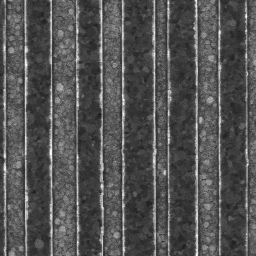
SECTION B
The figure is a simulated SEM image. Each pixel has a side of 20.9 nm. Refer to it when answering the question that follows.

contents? parallel lines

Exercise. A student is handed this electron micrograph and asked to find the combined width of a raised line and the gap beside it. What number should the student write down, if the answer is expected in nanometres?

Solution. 1020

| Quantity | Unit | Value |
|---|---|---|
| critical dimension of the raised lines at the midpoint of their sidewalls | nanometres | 591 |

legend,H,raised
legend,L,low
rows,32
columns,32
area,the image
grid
HLLHHHLLLLHHHLLHHHHLLHHHHLLHHHHL
HLLHHHLLLLHHHLLHHHHLLHHHHLLHHHHL
HLLHHHLLLLHHHLLHHHHLLHHHHLLHHHHL
HLLHHHLLLLHHHLLHHHHLLHHHHLLHHHHL
HLLHHHLLLLHHHLLHHHHLLHHHHLLHHHHL
HLLHHHLLLLHHHLLHHHHLLHHHHLLHHHHL
HLLHHHLLLLHHHLLHHHHLLHHHHLLHHHHL
HLLHHHLLLLHHHLLHHHHLLHHHHLLHHHHL
HLLHHHLLLLHHHLLHHHHLLHHHHLLHHHHL
HLLHHHLLLLHHHLLHHHHLLHHHHLLHHHHL
HLLHHHLLLLHHHLLHHHHLLHHHHLLHHHHL
HLLHHHLLLLHHHLLHHHHLLHHHHLLHHHHL
HLLHHHLLLLHHHLLHHHHLLHHHHLLHHHHL
HLLHHHLLLLHHHLLHHHHLLHHHHLLHHHHL
HLLHHHLLLLHHHLLHHHHLLHHHHLLHHHHL
HLLHHHLLLLHHHLLHHHHLLHHHHLLHHHHL
HLLHHHLLLLHHHLLHHHHLLHHHHLLHHHHL
HLLHHHLLLLHHHLLHHHHLLHHHHLLHHHHL
HLLHHHLLLLHHHLLHHHHLLHHHHLLHHHHL
HLLHHHLLLLHHHLLHHHHLLHHHHLLHHHHL
HLLHHHLLLLHHHLLHHHHLLHHHHLLHHHHL
HLLHHHLLLLHHHLLHHHHLLHHHHLLHHHHL
HLLHHHLLLLHHHLLHHHHLLHHHHLLHHHHL
HLLHHHLLLLHHHLLHHHHLLHHHHLLHHHHL
HLLHHHLLLLHHHLLHHHHLLHHHHLLHHHHL
HLLHHHLLLLHHHLLHHHHLLHHHHLLHHHHL
HLLHHHLLLLHHHLLHHHHLLHHHHLLHHHHL
HLLHHHLLLLHHHLLHHHHLLHHHHLLHHHHL
HLLHHHLLLLHHHLLHHHHLLHHHHLLHHHHL
HLLHHHLLLLHHHLLHHHHLLHHHHLLHHHHL
HLLHHHLLLLHHHLLHHHHLLHHHHLLHHHHL
HLLHHHLLLLHHHLLHHHHLLHHHHLLHHHHL